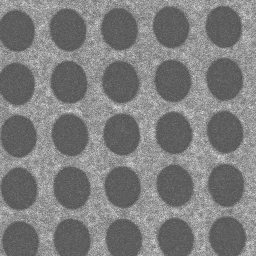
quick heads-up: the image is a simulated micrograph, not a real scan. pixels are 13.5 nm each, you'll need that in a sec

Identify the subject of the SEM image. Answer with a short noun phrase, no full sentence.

a regular array of holes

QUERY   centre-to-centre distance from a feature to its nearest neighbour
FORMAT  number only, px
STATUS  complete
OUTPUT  51.5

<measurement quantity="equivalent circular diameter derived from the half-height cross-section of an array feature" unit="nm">535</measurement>